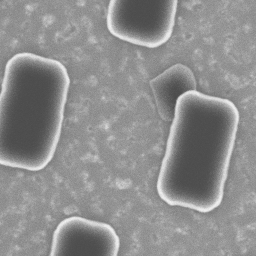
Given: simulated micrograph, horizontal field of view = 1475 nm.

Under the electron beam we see raised bodies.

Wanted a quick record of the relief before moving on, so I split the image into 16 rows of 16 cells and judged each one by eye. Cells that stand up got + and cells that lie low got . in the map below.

.......++++.....
.......++++.....
........++......
.+..............
++++............
++++............
++++.......+++..
++++.......++++.
++++.......++++.
+++.......++++..
..........++++..
..........++++..
..........++++..
................
....+++.........
...++++.........